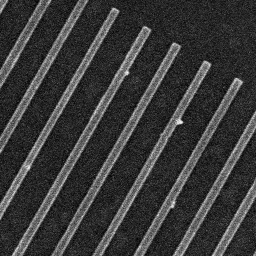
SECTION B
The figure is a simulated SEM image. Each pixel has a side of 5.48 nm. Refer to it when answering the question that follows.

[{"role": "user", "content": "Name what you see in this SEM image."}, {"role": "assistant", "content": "parallel lines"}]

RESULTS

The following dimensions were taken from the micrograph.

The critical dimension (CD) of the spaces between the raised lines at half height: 145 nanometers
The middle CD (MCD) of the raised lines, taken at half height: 42.3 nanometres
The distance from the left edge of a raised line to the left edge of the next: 189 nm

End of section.